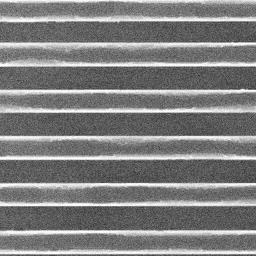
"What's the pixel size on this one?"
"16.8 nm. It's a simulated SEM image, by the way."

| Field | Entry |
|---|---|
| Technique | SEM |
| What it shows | lines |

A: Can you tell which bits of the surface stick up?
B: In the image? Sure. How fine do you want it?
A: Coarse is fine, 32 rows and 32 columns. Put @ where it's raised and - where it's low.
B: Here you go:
@@@@@@@@@@@@@@@@@@@@@@@@@@@@@@@@
@@@@@@@@@@@@@@@@@@@@@@@@@@@@@@@@
@@@@@@----@@---------@@--@@@@---
--------------------------------
--------------------------------
-------------------------@@-@@@@
@@@@@@@@@@@@@@@@@@@@@@@@@@@@@@@@
@@@@@@@@@@@@@@@@@@@@@@@@@@@@@@@@
--------------------------------
--------------------------------
--------------------------------
@@@@@@@@@@@@@@@@@@@@@@@@@@@@@@@@
@@@@@@@@@@@@@@@@@@@@@@@@@@@@@@@@
@@@@@@@@@@@@@@@@@@@@@@@@@@@@@@@@
--------------------------------
--------------------------------
--------------------------------
@@@@@@@@@@@@@@@@@@@@@@@@@@@@@@@@
@@@@@@@@@@@@@@@@@@@@@@@@@@@@@@@@
@@@@@@@@@@@@@@@@@@@@@@@@@@@@@@@@
--------------------------------
--------------------------------
--------------------------------
@@@@@@@@@@@@@@@@@@@@@@@@@@@@@@@@
@@@@@@@@@@@@@@@@@@@@@@@@@@@@@@@@
@@@@@@@@@@@@@@@@@@@@@@@@@@@@@@@@
--------------------------------
--------------------------------
--------------------------------
@@@@@@@@@@@@@@@@@@@@@@@@@@@@@@@@
@@@@@@@@@@@@@@@@@@@@@@@@@@@@@@@@
@@@@@@@@@@@@@@@@@@@@@@@@@@@@@@@@